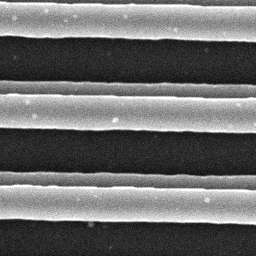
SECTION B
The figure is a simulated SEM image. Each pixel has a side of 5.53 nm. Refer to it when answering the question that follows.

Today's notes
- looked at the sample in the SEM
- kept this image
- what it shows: lines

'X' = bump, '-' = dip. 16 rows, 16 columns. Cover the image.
XXXXXXXXXXXXXXXX
XXXXXXXXXXXXXXXX
-------------XXX
----------------
----------------
XXXXXXXXXXXXXXXX
XXXXXXXXXXXXXXXX
XXXXXXXXXXXXXXXX
----------------
----------------
----------------
XXXXXXXXXXXXXXXX
XXXXXXXXXXXXXXXX
XXXXXXXXXXXXXXXX
----------------
----------------